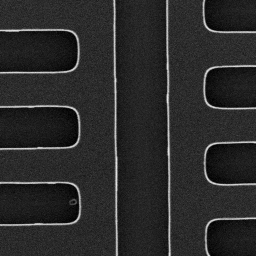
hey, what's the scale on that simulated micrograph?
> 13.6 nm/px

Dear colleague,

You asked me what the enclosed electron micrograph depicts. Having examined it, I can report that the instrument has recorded groups of lines, slits or small figures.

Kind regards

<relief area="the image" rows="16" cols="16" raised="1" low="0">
1111111000111000
1111111000111000
0000011000111111
0000011000111111
0000111000111000
1111111000111000
1111111000111000
0000011000011111
0000011000011111
1111111000011000
1111111000011000
0000111000011100
0000011000011111
0000011000011111
1111111000011000
1111111000011000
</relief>